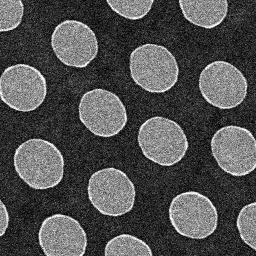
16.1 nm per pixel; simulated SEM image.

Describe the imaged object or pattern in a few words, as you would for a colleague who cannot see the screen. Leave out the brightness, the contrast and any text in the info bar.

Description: a regular array of raised bodies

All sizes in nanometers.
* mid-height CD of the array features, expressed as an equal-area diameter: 749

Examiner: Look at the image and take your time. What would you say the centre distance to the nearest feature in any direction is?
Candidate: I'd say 1160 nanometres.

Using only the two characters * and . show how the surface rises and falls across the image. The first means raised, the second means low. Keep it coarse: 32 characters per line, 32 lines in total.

***...........*****....*****....
***............***.....*****....
***.....................****....
**.....****.....................
.......*****....................
......******....................
.......*****.....****...........
........***.....******..........
.***............******....***...
*****...........******...*****..
******...........*****...******.
******.....***...........******.
*****.....*****...........****..
..**......*****.................
..........******................
...........*****..****..........
............***..******....****.
....*............******....*****
..*****...........*****....*****
..******..........*****....*****
..******............**.....*****
..******....***.............***.
...****....*****................
....**.....******...............
...........******.....***.......
............*****....*****.....*
*............***.....******...**
*.....***............******...**
*....*****............*****...**
.....******....*.......***....**
.....******...****.............*
......****...******.............